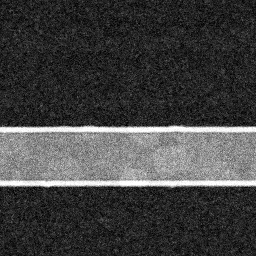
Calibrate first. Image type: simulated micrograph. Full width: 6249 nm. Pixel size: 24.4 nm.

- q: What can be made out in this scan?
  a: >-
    one or a few lines or trenches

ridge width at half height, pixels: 53.9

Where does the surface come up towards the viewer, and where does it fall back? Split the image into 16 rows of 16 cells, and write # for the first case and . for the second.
................
................
................
................
................
................
................
................
################
################
################
................
................
................
................
................